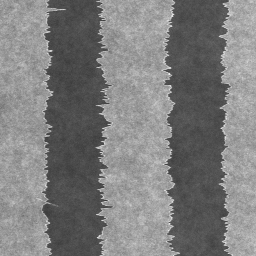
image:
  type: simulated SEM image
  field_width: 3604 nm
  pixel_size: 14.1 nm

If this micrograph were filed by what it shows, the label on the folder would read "one or a few lines or trenches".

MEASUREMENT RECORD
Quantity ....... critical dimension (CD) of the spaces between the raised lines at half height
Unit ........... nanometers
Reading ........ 783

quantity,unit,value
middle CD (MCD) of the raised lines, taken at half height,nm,922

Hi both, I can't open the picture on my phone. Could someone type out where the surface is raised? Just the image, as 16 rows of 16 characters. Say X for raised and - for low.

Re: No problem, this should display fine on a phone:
XXX---XXXXX---XX
XXX---XXXXX---XX
XXX---XXXX----XX
XXX---XXXX----XX
XXX---XXXX----XX
XXX----XXXX---XX
XXX----XXXX---XX
XXX----XXXX---XX
XXX---XXXXX---XX
XXX---XXXXX---XX
XXX---XXXX----XX
XXX---XXXXX---XX
XXX----XXXX---XX
XXX---XXXXX---XX
XXX---XXXXX---XX
XXX---XXXXX---XX